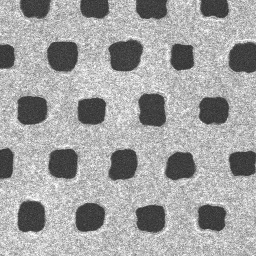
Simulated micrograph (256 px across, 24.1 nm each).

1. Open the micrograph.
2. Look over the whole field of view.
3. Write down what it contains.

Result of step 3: a regular array of holes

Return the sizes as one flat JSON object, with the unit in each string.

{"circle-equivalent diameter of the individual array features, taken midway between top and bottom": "732 nanometers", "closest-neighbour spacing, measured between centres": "59.7 pixels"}